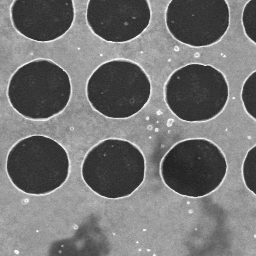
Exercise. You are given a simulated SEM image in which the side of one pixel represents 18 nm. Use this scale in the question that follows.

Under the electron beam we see holes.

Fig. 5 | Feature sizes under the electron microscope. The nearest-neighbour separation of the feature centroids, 1360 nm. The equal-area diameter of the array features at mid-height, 1090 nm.